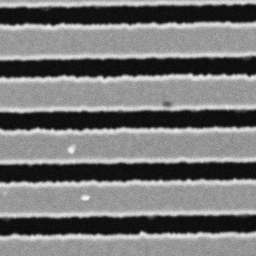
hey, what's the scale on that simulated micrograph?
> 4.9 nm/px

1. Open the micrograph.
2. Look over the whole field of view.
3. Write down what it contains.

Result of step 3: lines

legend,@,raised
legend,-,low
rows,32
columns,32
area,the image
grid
@@@@@@@@@@@@@@@@@@@@@@@@@@@@@@@@
--------------------------------
--------------------------------
@@@@@@@@@@@@@@@@@@@@@@@@@@@@@@@@
@@@@@@@@@@@@@@@@@@@@@@@@@@@@@@@@
@@@@@@@@@@@@@@@@@@@@@@@@@@@@@@@@
@@@@@@@@@@@@@@@@@@@@@@@@@@@@@@@@
@@-@----------------------------
--------------------------------
--------@------@-@@@@@@@@@@@@@@@
@@@@@@@@@@@@@@@@@@@@@@@@@@@@@@@@
@@@@@@@@@@@@@@@@@@@@@@@@@@@@@@@@
@@@@@@@@@@@@@@@@@@@@@@@@@@@@@@@@
@@@@@@@@@@@@@@@@@@@@@@@@@@@@@@@@
--------------------------------
--------------------------------
@@@@@@@@@@@@@@@@@@@@@@@@@@@@@@@@
@@@@@@@@@@@@@@@@@@@@@@@@@@@@@@@@
@@@@@@@@@@@@@@@@@@@@@@@@@@@@@@@@
@@@@@@@@@@@@@@@@@@@@@@@@@@@@@@@@
@@@@@@@@@@----------------------
--------------------------------
-----------@----@@-----@@@@@-@@@
@@@@@@@@@@@@@@@@@@@@@@@@@@@@@@@@
@@@@@@@@@@@@@@@@@@@@@@@@@@@@@@@@
@@@@@@@@@@@@@@@@@@@@@@@@@@@@@@@@
@@@@@@@@@@@@@@@@@@@@@@@@@@@@@@@@
--------------------------------
--------------------------------
@@@@@@@@@@@@@@@@@@@@@@@@@@@@@@@@
@@@@@@@@@@@@@@@@@@@@@@@@@@@@@@@@
@@@@@@@@@@@@@@@@@@@@@@@@@@@@@@@@